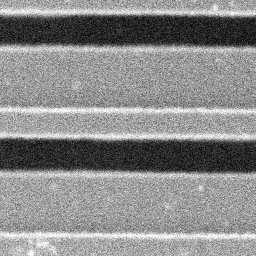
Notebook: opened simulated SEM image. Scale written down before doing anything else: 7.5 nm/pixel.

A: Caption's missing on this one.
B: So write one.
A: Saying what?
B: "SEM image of lines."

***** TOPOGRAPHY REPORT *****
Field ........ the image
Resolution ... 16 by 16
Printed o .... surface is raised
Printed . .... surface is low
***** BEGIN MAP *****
oooooooooooooooo
................
................
oooooooooooooooo
oooooooooooooooo
oooooooooooooooo
oooooooooooooooo
oooooooooooooooo
oooooooooooooooo
................
................
oooooooooooooooo
oooooooooooooooo
oooooooooooooooo
oooooooooooooooo
oooooooooooooooo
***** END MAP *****